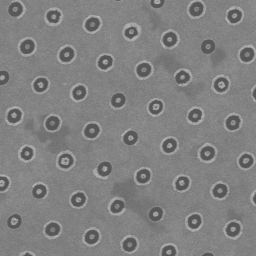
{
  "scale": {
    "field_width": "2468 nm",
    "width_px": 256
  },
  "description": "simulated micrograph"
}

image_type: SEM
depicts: a regular array of ring-shaped grooves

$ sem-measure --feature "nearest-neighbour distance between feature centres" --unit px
39.2